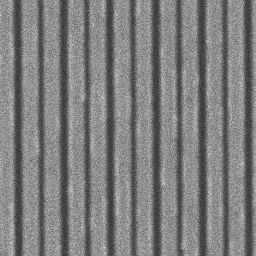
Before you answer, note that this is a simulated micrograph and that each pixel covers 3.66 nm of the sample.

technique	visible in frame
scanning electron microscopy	parallel lines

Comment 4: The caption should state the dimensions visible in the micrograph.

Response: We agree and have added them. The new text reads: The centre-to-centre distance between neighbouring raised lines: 0.0837 microns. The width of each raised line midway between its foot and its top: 58.6 nanometers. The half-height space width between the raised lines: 0.032 µm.